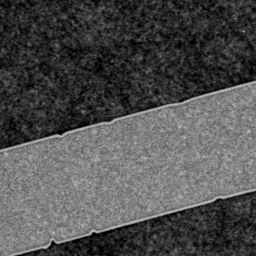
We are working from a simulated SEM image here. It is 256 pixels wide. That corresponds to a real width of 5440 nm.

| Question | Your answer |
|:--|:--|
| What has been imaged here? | one or a few lines or trenches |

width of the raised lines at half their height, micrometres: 2.2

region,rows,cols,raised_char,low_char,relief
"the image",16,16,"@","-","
----------------
----------------
----------------
----------------
----------------
--------------@@
-----------@@@@@
-------@@@@@@@@@
----@@@@@@@@@@@@
@@@@@@@@@@@@@@@@
@@@@@@@@@@@@@@@@
@@@@@@@@@@@@@@@@
@@@@@@@@@@@@@---
@@@@@@@@@@------
@@@@@@----------
@@@-------------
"